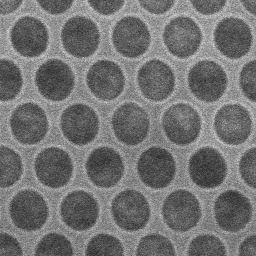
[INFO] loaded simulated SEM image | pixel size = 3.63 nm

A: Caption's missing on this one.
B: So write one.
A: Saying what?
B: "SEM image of a regular array of holes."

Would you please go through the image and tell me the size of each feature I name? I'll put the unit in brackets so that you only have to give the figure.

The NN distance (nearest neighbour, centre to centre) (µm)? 0.181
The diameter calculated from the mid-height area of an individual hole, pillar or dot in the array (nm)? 152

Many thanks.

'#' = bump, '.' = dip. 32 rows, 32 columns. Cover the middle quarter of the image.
..####........#####........#####
..####.........###.........####.
...###.........###..........###.
...##..........###..........###.
...##...........##..........###.
...###.........###..........###.
..####.........###..........###.
..#####.......#####........#####
.#######......######......######
###..#####.#####.#####...####.##
#......#######.....#######......
........#####.......#####.......
........####.........####.......
.........###.........###........
.........###..........##........
.........###..........##........
.........###.........####.......
.........###.........####.......
........#####........#####......
#......#######......#######.....
###..####..#####..###########..#
#######......#######......######
.#####........#####........#####
..####.........###..........###.
..###..........###..........###.
...##..........###..........###.
...##..........###..........###.
..####.........###..........###.
..####.........####.........###.
.######.......######.......#####
########.....#######......######
##...#########.....########....#